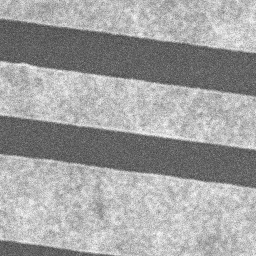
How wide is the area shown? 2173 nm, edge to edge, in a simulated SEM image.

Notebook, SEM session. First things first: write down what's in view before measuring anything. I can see one or a few lines or trenches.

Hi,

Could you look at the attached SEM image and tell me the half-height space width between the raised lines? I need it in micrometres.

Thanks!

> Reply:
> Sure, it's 0.356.